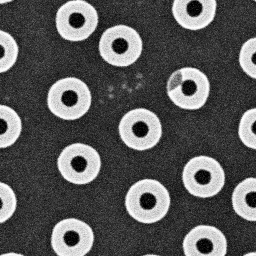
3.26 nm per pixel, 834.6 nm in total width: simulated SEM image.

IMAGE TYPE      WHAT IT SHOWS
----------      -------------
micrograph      ring-shaped raised bodies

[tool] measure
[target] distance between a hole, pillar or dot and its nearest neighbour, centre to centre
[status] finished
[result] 209 nm